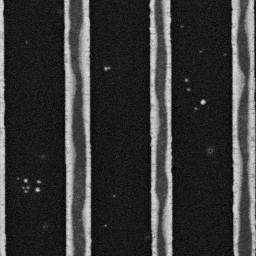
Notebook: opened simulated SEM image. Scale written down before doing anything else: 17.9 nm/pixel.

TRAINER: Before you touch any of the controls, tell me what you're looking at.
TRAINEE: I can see lines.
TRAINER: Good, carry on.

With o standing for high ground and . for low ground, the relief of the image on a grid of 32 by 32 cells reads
........ooo........oo........oo.
........ooo........oo........oo.
........ooo........oo........oo.
........ooo........oo........oo.
........ooo........oo........oo.
........ooo........oo........oo.
........ooo........oo........ooo
........ooo........oo........ooo
........ooo........oo........ooo
........ooo........oo........ooo
.........oo........oo........ooo
........ooo........oo........ooo
........ooo........oo........ooo
........ooo........oo........ooo
........ooo........oo........ooo
........ooo........oo........ooo
........ooo........oo........ooo
........ooo........oo........ooo
........ooo........oo........ooo
.........oo........oo........ooo
.........oo........oo........ooo
.........oo........oo........ooo
.........oo........oo........ooo
.........oo........oo........ooo
.........oo........oo........ooo
........ooo........oo........ooo
........ooo........oo........ooo
........ooo........oo........ooo
........ooo........oo........ooo
.........oo........oo........ooo
.........oo........oo........ooo
.........oo........oo........ooo